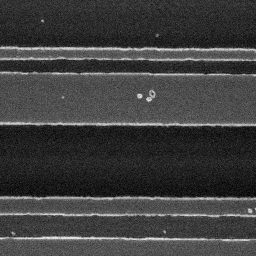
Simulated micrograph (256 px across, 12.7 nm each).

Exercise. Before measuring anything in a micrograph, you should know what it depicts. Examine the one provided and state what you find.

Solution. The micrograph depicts lines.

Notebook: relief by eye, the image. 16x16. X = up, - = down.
----------------
----------------
----------------
XXXXXXXXXXXXXXXX
XXXXXXXXXXXXXXXX
XXXXXXXXXXXXXXXX
XXXXXXXXXXXXXXXX
XXXXXXXXXXXXXXXX
----------------
----------------
----------------
----------------
XXXXXXXXXXXXXXXX
XXXXXXXXXXXXXXXX
XXXXXXXXXXXXXXXX
XXXXXXXXXXXXXXXX